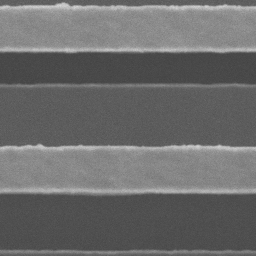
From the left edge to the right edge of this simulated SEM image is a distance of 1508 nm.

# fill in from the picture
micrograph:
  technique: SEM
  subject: lines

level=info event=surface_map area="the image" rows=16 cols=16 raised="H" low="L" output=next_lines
HHHHHHHHHHHHHHHH
HHHHHHHHHHHHHHHH
HHHHHHHHHHHHHHHH
LLLLLLLLLLLLLLLL
LLLLLLLLLLLLLLLL
HHHHHHHHHHHHHHHH
HHHHHHHHHHHHHHHH
HHHHHHHHHHHHHHHH
HHHHHHHHHHHHHHHH
HHHHHHHHHHHHHHHH
HHHHHHHHHHHHHHHH
HHHHHHHHHHHHHHHH
LLLLLLLLLLLLLLLL
LLLLLLLLLLLLLLLL
LLLLLLLLLLLLLLLL
LLLLLLLLLLLLLLLL